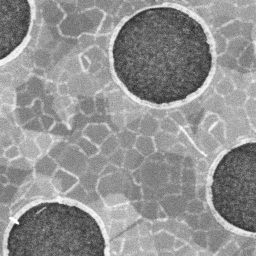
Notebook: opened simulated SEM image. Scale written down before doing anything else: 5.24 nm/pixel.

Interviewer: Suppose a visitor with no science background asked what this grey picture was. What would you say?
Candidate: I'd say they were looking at holes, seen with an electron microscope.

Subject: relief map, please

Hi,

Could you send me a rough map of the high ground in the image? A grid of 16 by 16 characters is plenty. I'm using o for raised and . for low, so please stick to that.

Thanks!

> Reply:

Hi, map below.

..ooooooo..ooooo
..oooooo....oooo
.oooooo......ooo
ooooooo......ooo
ooooooo......ooo
oooooooo....oooo
oooooooooooooooo
oooooooooooooooo
oooooooooooooooo
oooooooooooooo..
ooooooooooooo...
ooooooooooooo...
ooooooooooooo...
o.....oooooooo..
o.....oooooooooo
.......ooooooooo